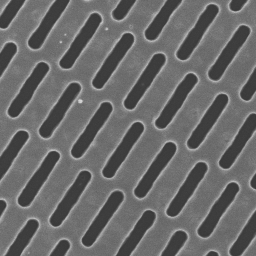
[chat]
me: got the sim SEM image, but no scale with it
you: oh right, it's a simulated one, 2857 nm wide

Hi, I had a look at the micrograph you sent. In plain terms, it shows a regular array of holes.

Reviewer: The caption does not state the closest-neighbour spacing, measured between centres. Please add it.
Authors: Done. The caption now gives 418 nm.